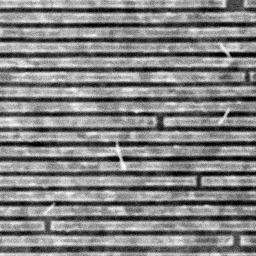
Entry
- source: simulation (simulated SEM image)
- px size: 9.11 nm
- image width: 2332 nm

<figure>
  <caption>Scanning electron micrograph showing parallel lines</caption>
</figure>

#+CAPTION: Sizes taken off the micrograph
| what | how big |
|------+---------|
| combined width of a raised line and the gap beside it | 135 nm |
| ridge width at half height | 80.8 nm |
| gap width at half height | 0.0569 micrometres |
